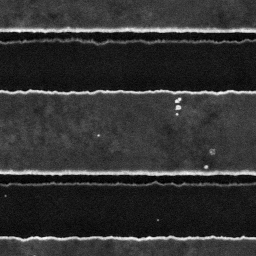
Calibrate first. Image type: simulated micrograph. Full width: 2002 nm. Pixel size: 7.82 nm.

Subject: lines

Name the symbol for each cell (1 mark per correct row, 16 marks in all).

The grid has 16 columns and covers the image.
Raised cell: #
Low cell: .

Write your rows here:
################
################
................
................
................
................
################
################
################
################
################
................
................
................
................
################